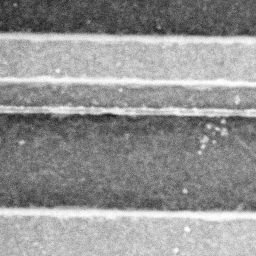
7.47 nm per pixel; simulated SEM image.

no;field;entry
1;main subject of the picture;lines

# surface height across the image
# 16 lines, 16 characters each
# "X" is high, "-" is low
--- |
----------------
----------------
XXXXXXXXXX------
XXXXXXXXXXXXXXXX
XXXXXXXXXXXXXXXX
XXXXXXXXXXXXXXXX
XXXXXXXXXXXXXXXX
----------------
----------------
----------------
----------------
----------------
----------------
XXXXXXXXXX------
XXXXXXXXXXXXXXXX
XXXXXXXXXXXXXXXX